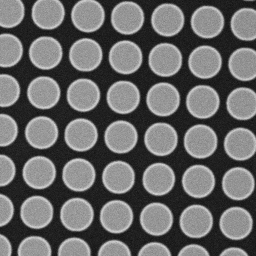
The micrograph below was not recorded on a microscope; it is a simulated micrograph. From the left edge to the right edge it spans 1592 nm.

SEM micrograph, an array of small figures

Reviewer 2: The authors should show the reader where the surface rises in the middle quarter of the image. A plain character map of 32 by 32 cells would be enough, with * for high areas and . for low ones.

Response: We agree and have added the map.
..******....*******...*******..*
....***......*****....*******...
.......................****.....
................................
..*****.......**................
..******....******.....****.....
.********..*******...*******....
.********..********..********..*
.********..********..********..*
.********..********..********..*
..******...*******...*******...*
...***......*****.....******...*
.......................****.....
................................
..*****......***................
.*******...******.....****......
********...*******...*******...*
********..********..********...*
********..********..********..**
.*******..********..********..**
.******....******....*******..**
...***......****.....******....*
.......................***.....*
................................
.*****......***.................
*******....*****.....*****......
********..*******....******....*
********..*******...*******...**
********..*******...********..**
*******...*******...********..**
.******...*******...*******...**
..***......*****.....******...**